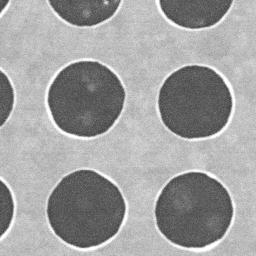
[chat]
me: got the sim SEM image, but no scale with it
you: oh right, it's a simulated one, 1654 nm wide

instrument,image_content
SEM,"holes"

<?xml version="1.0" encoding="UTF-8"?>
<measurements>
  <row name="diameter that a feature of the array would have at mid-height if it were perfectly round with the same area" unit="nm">504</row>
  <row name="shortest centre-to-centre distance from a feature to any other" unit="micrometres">0.699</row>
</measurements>